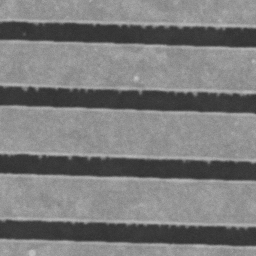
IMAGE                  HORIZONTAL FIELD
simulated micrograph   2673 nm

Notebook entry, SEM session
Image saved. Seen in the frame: lines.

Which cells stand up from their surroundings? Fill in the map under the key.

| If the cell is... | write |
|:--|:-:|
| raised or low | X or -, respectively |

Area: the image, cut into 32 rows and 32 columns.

XXXXXXXXXXXXXXXXXXXXXXXXXXXXXXXX
XXXXXXXXXXXXXXXXXXXXXXXXXXXXXXXX
XXXXXXXXXXXXXXXXXXXXXXXXXXXXXXXX
--------------------------------
--------------------------------
XXXXXXXXXXXXXX------------------
XXXXXXXXXXXXXXXXXXXXXXXXXXXXXXXX
XXXXXXXXXXXXXXXXXXXXXXXXXXXXXXXX
XXXXXXXXXXXXXXXXXXXXXXXXXXXXXXXX
XXXXXXXXXXXXXXXXXXXXXXXXXXXXXXXX
XXXXXXXXXXXXXXXXXXXXXXXXXXXXXXXX
-----------------------------XXX
--------------------------------
XXXXXXX-------------------------
XXXXXXXXXXXXXXXXXXXXXXXXXXXXXXXX
XXXXXXXXXXXXXXXXXXXXXXXXXXXXXXXX
XXXXXXXXXXXXXXXXXXXXXXXXXXXXXXXX
XXXXXXXXXXXXXXXXXXXXXXXXXXXXXXXX
XXXXXXXXXXXXXXXXXXXXXXXXXXXXXXXX
-------------XXXXXXXXXXXXXXXXXXX
--------------------------------
--------------------------------
XXXXXXXXXXXXXXXXXXXXXXX---------
XXXXXXXXXXXXXXXXXXXXXXXXXXXXXXXX
XXXXXXXXXXXXXXXXXXXXXXXXXXXXXXXX
XXXXXXXXXXXXXXXXXXXXXXXXXXXXXXXX
XXXXXXXXXXXXXXXXXXXXXXXXXXXXXXXX
---------XXXXXXXXXXXXXXXXXXXXXXX
--------------------------------
--------------------------------
XXXXXXXXXXXXXXXX----------------
XXXXXXXXXXXXXXXXXXXXXXXXXXXXXXXX